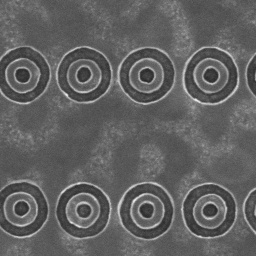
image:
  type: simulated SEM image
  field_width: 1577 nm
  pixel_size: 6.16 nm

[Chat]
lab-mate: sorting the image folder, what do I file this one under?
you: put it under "ring-shaped grooves with a dot in the middle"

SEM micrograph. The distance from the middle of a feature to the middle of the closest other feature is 62.3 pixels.